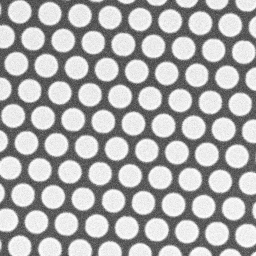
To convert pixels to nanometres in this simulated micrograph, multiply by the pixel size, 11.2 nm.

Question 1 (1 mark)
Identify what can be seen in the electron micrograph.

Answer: an array of small figures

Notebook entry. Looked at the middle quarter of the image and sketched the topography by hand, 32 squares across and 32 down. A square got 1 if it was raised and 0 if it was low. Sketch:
11111100111110001111100011110000
11111100111110001111100111110001
01111000111110001111100111110001
00110000011100001111000111110001
00000000000000000110000011100001
10000111000000100000000000000000
10001111100011110000111000000000
11001111100111111001111100011110
10001111100111111001111100111111
00001111100011110001111100111111
00000000000011110001111100011110
01100000000000000000000000001100
11111000111100001100000000000000
11111001111100011111000111100001
11111001111100011111001111110011
11111001111100011111001111110011
00100000111100011111001111100011
00000000000000001100000111100011
00001110000001000000000000000001
10011111000111100001110000011000
10011111001111110011111000111100
10011111001111110011111000111110
00001111000111110011111000111110
00000000000011100001111000111110
11100000000000000000000000011100
11110001111000011100000000000000
11110011111100111110001111000011
11110011111100111110001111100111
11110001111100111110011111100111
11000001111000111110001111100111
00000000000000001100001111000111
00011100000000000000000000000000